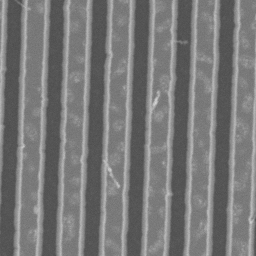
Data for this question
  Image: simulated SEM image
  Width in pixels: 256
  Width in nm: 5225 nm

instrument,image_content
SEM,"parallel lines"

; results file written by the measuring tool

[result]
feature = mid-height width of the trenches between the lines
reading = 403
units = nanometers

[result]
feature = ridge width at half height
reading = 0.454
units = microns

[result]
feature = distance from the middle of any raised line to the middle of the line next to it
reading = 867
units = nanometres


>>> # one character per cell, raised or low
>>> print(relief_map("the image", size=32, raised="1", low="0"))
10011100111000111001110011100011
10011100111000111001110011100011
10011100111000110001110011100011
00011100111000110001110011100011
00011100111000110001110011100011
00011100111000110001110011100011
00011100111000110001110011100011
00011100111000110001110011100111
00011100111001110001110011100111
00011100111001110001110011100111
00011000111001110001110011100111
00011100111001110001100011100111
00011100111001110001100011100111
00011000111001110001100011100111
00011000111001110001100011100111
00011000111001110001100011100111
00011000111001110001100011100111
00011000111001110001100011100111
00011000111001110011100011100111
00111000111001110011100011000111
00011000110001110011100011000111
00111000110001110011100011000111
00111000110001110011100011000111
00111000110001110011100011000111
00111000110001110011100011000111
00111000110001110011100111000111
00111000110001110011100011000111
00111001110001110011100011000111
00111000110001110011100111000110
00111001110001100011100111000110
00111001110001110011100111000110
00111001110001100011100111000110